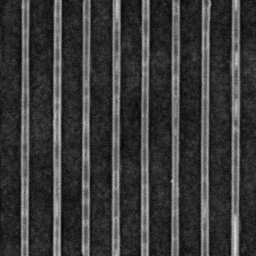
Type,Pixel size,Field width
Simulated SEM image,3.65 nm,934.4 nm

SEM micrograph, parallel lines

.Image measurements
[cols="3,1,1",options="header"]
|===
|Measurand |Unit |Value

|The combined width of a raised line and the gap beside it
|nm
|110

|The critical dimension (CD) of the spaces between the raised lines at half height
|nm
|85.3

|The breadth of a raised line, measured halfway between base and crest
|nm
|22.8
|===